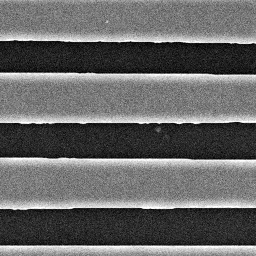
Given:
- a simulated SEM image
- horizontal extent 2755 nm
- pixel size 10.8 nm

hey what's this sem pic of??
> lines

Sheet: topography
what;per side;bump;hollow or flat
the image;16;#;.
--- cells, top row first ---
################
################
################
................
................
################
################
################
................
................
################
################
################
................
................
################